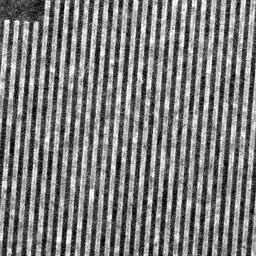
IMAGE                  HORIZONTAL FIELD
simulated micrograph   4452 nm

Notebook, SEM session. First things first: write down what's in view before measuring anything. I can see parallel lines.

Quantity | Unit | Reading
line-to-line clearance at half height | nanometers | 106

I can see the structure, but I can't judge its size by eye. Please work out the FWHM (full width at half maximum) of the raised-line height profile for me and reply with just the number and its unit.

65 nanometers